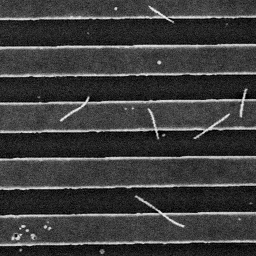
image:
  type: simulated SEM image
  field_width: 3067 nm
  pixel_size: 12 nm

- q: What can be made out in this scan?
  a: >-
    lines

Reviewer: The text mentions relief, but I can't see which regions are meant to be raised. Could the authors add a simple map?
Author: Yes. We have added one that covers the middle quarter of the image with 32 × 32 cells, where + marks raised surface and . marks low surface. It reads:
++++++++++++++++++++++++++++++++
++++++++++++++++++++++++++++++++
++++++++++++++++++++++++++++++..
................................
................................
................................
................................
................................
................................
.....+.....+++++++++++++++++++++
++++++++++++++++++++++++++++++++
++++++++++++++++++++++++++++++++
++++++++++++++++++++++++++++++++
++++++++++++++++++++++++++++++++
++++++++++++++++++++++++++++++++
++++++++++++++++++++++++++++++++
+++++++++++++++++++++..+........
................................
................................
................................
................................
................................
................................
............++++++++++++++++++++
++++++++++++++++++++++++++++++++
++++++++++++++++++++++++++++++++
++++++++++++++++++++++++++++++++
++++++++++++++++++++++++++++++++
++++++++++++++++++++++++++++++++
++++++++++++++++++++++++++++++++
+++++++++++++++++++++++++++.....
................................